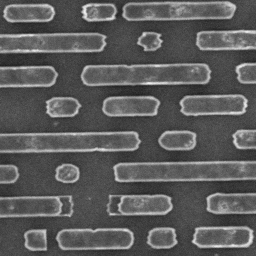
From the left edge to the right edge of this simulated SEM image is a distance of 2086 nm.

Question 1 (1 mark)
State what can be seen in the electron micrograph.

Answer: parallel lines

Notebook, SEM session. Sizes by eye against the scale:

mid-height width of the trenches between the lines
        117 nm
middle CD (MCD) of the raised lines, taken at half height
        149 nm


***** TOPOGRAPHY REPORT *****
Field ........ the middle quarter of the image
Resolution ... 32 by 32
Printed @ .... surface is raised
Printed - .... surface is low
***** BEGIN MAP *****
--------------@@@@@@@@@@@@@@@@@@
-----@@@@@@@@@@@@@@@@@@@@@@@@@@@
-----@@@@@@@@@@@@@@@@@@@@@@@@@@@
----@@@@@@@@@@@@@@@@@@@@@@@@@@@@
-----@@@@@@@@@@@@@@@@@@@@@@@@@@@
--------------------------------
--------------------------------
--------------------------------
-----------@@@@@@@@@@@--------@@
@@@-------@@@@@@@@@@@@@@-----@@@
@@@@------@@@@@@@@@@@@@------@@@
@@@-------@@@@@@@@@@@@@------@@@
@@@--------@@@@@@@@@@@@-------@@
--------------------------------
--------------------------------
--------------------------------
--------------------------------
@@@@@@@@@@@@@@@@@@-------@@@@@@@
@@@@@@@@@@@@@@@@@@@-----@@@@@@@@
@@@@@@@@@@@@@@@@@@@-----@@@@@@@@
@@@@@@@@@@@@@@@@@@@------@@@@@@@
@@@@@@@@@@@@@@@@@@--------------
--------------------------------
--------------------------------
--------------------------------
@@@----------@@@@@@@@@@@@@@@@@@@
@@@@---------@@@@@@@@@@@@@@@@@@@
@@@@---------@@@@@@@@@@@@@@@@@@@
@@@----------@@@@@@@@@@@@@@@@@@@
--------------------------------
--------------------------------
--------------------------------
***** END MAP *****